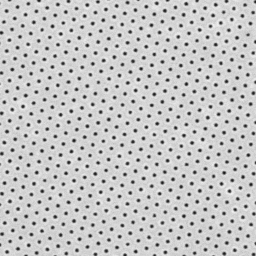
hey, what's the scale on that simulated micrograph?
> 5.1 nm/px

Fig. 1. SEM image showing a regular array of holes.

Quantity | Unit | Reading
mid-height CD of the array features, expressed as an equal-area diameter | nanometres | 19.1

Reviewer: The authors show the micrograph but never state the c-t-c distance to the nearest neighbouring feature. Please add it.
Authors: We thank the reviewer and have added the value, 55.1 nm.